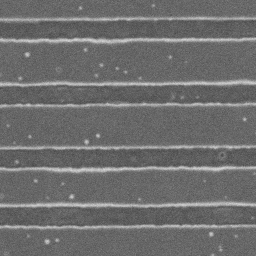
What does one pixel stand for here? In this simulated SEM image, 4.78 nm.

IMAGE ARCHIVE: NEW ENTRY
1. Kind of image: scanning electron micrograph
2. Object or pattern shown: lines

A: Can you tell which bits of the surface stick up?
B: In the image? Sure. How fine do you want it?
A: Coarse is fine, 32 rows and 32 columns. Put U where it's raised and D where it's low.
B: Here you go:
UUUUUUUUUUUUUUUUUUUUUUUUUUUUUUUU
UUUUUUUUUUUUUUUUUUUUUUUUUUUUUUUU
DDDDUDDDDDDDDDDDDDDDDDDDDDDDDDDD
DDDDDDDDDDDDDDDDDDDDDDDDDDDDDDDD
DDDDDDDDDDDDDDDDDDDDDDDDDDDDDDDD
UUUUUUUUUUUUUUUUUUUUUUUUUUUUUUUU
UUUUUUUUUUUUUUUUUUUUUUUUUUUUUUUU
UUUUUUUUUUUUUUUUUUUUUUUUUUUUUUUU
UUUUUUUUUUUUUUUUUUUUUUUUUUUUUUUU
UUUUUUUUUUUUUUUUUUUUUUUUUUUUUUUU
UUUUUUUDUUUUUUUUUUUUUUDUDUDDDDDD
DDDDDDDDDDDDDDDDDDDDDDDDDDDDDDDD
DDDDDDDDDDDDDDDDDDDDDDDDDDDDDDDD
UUUUUUUUUUUUUUUUUUUUUUUUUUUUUUUU
UUUUUUUUUUUUUUUUUUUUUUUUUUUUUUUU
UUUUUUUUUUUUUUUUUUUUUUUUUUUUUUUU
UUUUUUUUUUUUUUUUUUUUUUUUUUUUUUUU
UUUUUUUUUUUUUUUUUUUUUUUUUUUUUUUU
UUUUUUUUDUUUUUUUDDDDDDDDDDDDDDDD
DDDDDDDDDDDDDDDDDDDDDDDDDDDDDDDD
DDDDDDDDDDDDDDDDDDDDDDDDDDDDDDDD
UUUUUUUUUUUUUUUUUUUUUUUUUUUUUUUU
UUUUUUUUUUUUUUUUUUUUUUUUUUUUUUUU
UUUUUUUUUUUUUUUUUUUUUUUUUUUUUUUU
UUUUUUUUUUUUUUUUUUUUUUUUUUUUUUUU
UUUUUUUUUUUUUUUUUUUUUUUUUUUUUUUU
DDDDDDDDDDDDDDDDDDDDDDDDDDDDDDDD
DDDDDDDDDDDDDDDDDDDDDDDDDDDDDDDD
UUUUUUUUUUUUUUUUUUUUUUUUUUUUUUUU
UUUUUUUUUUUUUUUUUUUUUUUUUUUUUUUU
UUUUUUUUUUUUUUUUUUUUUUUUUUUUUUUU
UUUUUUUUUUUUUUUUUUUUUUUUUUUUUUUU